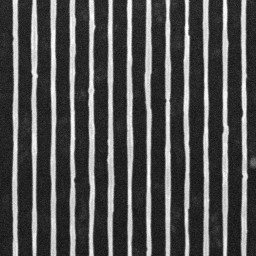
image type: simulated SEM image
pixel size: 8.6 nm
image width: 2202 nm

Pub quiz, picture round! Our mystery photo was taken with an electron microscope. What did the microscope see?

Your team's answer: parallel lines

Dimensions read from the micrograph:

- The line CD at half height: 34.4 nm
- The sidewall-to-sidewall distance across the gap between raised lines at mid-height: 128 nm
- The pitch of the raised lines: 164 nanometers